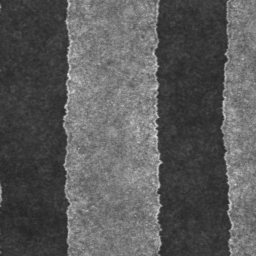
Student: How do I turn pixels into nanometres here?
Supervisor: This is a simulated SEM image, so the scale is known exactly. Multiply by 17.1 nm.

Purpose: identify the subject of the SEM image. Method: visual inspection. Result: one or a few lines or trenches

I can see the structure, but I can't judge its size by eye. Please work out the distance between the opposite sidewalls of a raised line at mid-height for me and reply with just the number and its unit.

1540 nm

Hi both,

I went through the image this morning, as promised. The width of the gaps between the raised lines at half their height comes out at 1.2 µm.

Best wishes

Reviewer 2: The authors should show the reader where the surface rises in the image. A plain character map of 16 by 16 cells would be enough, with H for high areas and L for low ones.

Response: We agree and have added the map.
LLLLHHHHHHLLLLHH
LLLLHHHHHHLLLLHH
LLLLHHHHHHLLLLHH
LLLLHHHHHHLLLLHH
LLLLHHHHHHLLLLHH
LLLLHHHHHHLLLLHH
LLLLHHHHHHLLLLHH
LLLLHHHHHHLLLLHH
LLLLHHHHHHLLLLHH
LLLLHHHHHHLLLLHH
LLLLHHHHHHLLLLHH
LLLLHHHHHHLLLLHH
LLLLHHHHHHLLLLHH
LLLLHHHHHHLLLLHH
LLLLHHHHHHLLLLHH
LLLLHHHHHHLLLLHH